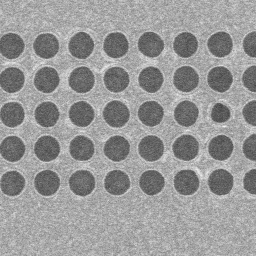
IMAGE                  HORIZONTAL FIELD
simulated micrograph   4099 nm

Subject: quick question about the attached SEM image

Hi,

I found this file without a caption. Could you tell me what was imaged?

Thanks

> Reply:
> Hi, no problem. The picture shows a regular array of holes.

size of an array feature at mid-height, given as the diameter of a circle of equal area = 429 nm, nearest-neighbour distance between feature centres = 546 nm